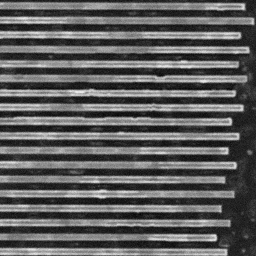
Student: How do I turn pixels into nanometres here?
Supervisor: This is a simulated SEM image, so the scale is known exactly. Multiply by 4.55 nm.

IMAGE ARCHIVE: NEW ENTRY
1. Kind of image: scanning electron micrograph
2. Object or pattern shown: parallel lines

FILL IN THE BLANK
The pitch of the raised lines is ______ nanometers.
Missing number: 65.7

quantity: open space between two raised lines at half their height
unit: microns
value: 0.0353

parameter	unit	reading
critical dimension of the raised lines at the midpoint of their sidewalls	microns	0.0307